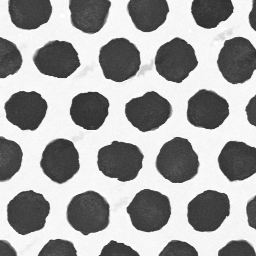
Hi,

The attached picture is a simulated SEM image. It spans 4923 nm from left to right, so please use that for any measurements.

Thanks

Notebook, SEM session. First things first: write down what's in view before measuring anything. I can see a regular array of holes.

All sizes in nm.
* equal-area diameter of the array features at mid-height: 808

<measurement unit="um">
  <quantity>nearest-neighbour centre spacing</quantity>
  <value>1.12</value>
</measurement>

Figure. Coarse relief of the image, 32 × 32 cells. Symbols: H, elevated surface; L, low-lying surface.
HLLLLLHHHLLLLLHHLLLLLHHHLLLLLHHH
HLLLLLHHHLLLLLHHLLLLLHHHLLLLLHHL
HLLLLLHHHLLLLHHHLLLLLHHHLLLLHHHL
HHHLHHHHHHLLLHHHHLLLHHHHHLLHHHHL
HHHHHHHHHHHHHHHHHHHHHHHHHHHHHHHH
LLHHHHLLLHHHHLLLLHHHHLLLHHHHLLLH
LLHHHLLLLLHHLLLLLHHHLLLLHHHLLLLL
LLLHLLLLLLHHLLLLLLHLLLLLLHHLLLLL
LLHHHLLLLLHHHLLLLHHHLLLLHHHLLLLL
LHHHHHLLLHHHHLLLLHHHLLLHHHHHLLLH
HHHHHHHHHHHHHHHHHHHHHHHHHHHHHLHH
HHLLLHHHHHHLHHHHHHLLHHHHHLLHHHHH
HLLLLLHHHLLLLLHHLLLLLHHHLLLLHHHL
HLLLLLHHHLLLLLHHLLLLLHHLLLLLLHHL
HLLLLLHHHLLLLHHHLLLLLHHLLLLLHHHL
HHLLLHHHHHLLLHHHLLLLHHHHLLLLHHHL
HHHHHHHHHHHHHHHHHHHHHHHHHHHHHHHH
LHHHHHHLHHHHHHHHHHHHHLLHHHHHHHHH
LLLHHHLLLHHHHLLLLHHHLLLLHHHHLLLL
LLLHHLLLLLHHLLLLLLHHLLLLLHHLLLLL
LLLHHLLLLLHHLLLLLLHLLLLLLHHLLLLL
LLHHHHLLLLHHHLLLLHHHLLLLLHHHLLLL
LHHHHHLLLHHHHHHLHHHHHLLLHHHHHLHH
HHHHHHHHHHHHHHHHHHHHHHHHHHHHHHHH
HHLLLHHHHLLLLHHHHLLLLHHHHLLLHHHH
HLLLLLHHHLLLLHHHLLLLLHHHLLLLLHHL
HLLLLLHHLLLLLLHHLLLLLHHLLLLLLHHL
HLLLLLHHHLLLLLHHLLLLLHHLLLLLHHHL
HHLLLHHHHLLLLHHHHLLLHHHHLLLHHHHH
HHHHHHHHHHHHHHHHHHHHHHHHHHHHHHHH
LHHHHHLLLHHHHLLHHHHHHLLLHHHHLLLH
LLHHHLLLLLHHHLLLLHHHLLLLLHHLLLLL